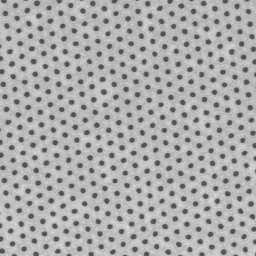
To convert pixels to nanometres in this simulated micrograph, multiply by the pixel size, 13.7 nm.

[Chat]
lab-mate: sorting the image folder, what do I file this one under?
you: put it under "a regular array of holes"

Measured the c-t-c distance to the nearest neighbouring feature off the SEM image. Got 169 nm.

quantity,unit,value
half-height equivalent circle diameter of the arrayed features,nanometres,73.9